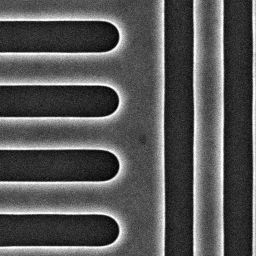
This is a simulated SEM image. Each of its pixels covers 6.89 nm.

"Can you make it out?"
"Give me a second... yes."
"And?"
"groups of lines, slits or small figures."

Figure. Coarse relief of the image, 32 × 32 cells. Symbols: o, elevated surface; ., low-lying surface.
oooooooooooooooooooo....oooo....
oooooooooooooooooooo....oooo....
.............ooooooo....oooo....
...............ooooo....oooo....
...............ooooo....oooo....
...............ooooo....oooo....
..............oooooo....oooo....
oooooooooooooooooooo....oooo....
oooooooooooooooooooo....oooo....
oooooooooooooooooooo....oooo....
oooooooooooooooooooo....oooo....
...............ooooo....oooo....
...............ooooo....oooo....
...............ooooo....oooo....
.............ooooooo....oooo....
oooooooooooooooooooo....oooo....
oooooooooooooooooooo....oooo....
oooooooooooooooooooo....oooo....
oooooooooooooooooooo....oooo....
..............oooooo....oooo....
...............ooooo....oooo....
...............ooooo....oooo....
..............oooooo....oooo....
ooooooooooooooooooooo...oooo....
ooooooooooooooooooooo...oooo....
ooooooooooooooooooooo...oooo....
ooooooooooooooooooooo...oooo....
..............ooooooo...oooo....
...............oooooo...oooo....
...............oooooo...oooo....
..............oooooo....oooo....
oooooooooooooooooooo....oooo....